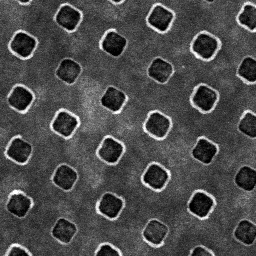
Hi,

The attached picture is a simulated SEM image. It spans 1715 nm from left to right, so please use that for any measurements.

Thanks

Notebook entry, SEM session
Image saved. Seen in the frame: a regular array of holes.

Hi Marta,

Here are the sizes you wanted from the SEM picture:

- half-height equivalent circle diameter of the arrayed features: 23.3 px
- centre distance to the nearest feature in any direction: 349 nm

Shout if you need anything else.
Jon